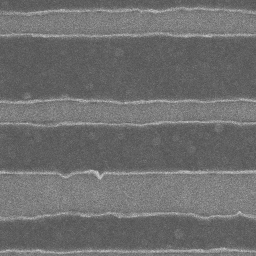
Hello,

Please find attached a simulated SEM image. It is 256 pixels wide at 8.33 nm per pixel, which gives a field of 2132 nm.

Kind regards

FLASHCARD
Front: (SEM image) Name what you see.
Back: one or a few lines or trenches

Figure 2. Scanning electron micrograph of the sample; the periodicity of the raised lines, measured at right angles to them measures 687 nm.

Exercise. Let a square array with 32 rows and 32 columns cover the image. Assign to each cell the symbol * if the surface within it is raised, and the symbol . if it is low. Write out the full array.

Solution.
********************************
******.............*...........*
................................
................................
*******...*..*******************
********************************
********************************
********************************
********************************
********************************
********************************
********************************
*******..***********************
................................
................................
****...******.....**************
********************************
********************************
********************************
********************************
********************************
********************************
................................
................................
................................
................................
................................
********************************
********************************
********************************
********************************
......***.......................